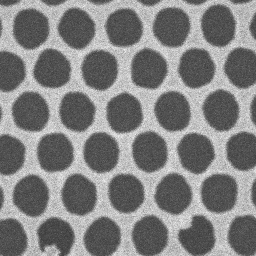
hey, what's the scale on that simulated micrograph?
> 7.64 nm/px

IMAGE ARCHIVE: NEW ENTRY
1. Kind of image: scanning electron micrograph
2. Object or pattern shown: a regular array of holes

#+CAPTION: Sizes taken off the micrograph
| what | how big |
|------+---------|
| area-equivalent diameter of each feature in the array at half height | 300 nanometres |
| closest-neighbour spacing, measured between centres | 46.3 px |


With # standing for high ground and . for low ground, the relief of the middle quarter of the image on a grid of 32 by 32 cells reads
..##..........###.........###...
..##..........###.........##....
..##.........####.........###...
..###........####........####...
.####........####........#####..
######......######......#######.
########...#####################
.....#########..########......##
......######......######.......#
.......####........####........#
........###........####.........
........###.........###.........
........###.........###.........
........###.........###.........
.......####.........###........#
.......####........#####.......#
##...#######......#######.....##
#######....########....########.
.#####......######.......#####..
..###........####........####...
..###.........###.........##....
..###.........###.........##....
..###.........###.........##....
...##.........###.........###...
..###........#####........###...
.#####.......#####.......####...
#######.....#######.....######..
##..##########...#########...###
#.....######......#######.....##
.......####........#####.......#
........###.........###.........
........###.........###.........